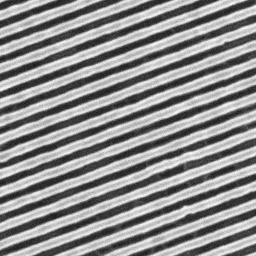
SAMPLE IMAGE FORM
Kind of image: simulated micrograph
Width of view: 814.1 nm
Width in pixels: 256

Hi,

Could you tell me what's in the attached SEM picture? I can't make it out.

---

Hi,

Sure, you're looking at parallel lines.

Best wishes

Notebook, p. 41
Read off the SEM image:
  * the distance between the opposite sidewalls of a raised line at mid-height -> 22.4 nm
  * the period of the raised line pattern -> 52.6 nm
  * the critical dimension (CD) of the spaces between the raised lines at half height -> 30.6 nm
